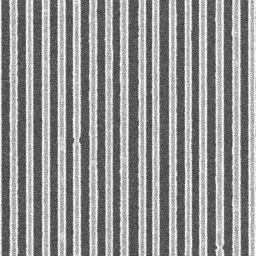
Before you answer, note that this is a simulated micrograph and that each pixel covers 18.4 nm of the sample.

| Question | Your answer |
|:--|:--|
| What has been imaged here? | parallel lines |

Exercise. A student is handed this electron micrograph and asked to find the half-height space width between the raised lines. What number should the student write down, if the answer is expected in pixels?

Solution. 9.75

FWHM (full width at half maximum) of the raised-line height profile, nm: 113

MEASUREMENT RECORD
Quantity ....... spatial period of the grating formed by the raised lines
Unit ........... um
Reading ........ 0.293